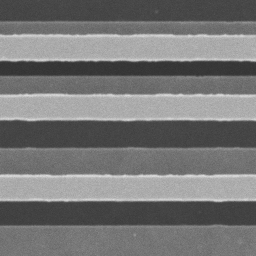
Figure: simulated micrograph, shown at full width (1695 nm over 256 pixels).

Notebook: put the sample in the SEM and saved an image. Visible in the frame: lines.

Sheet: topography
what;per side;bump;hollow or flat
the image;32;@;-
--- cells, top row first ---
--------------------------------
--------------------------------
--------------------------------
@@@@@@@@@@@@@@@@@@@@@@@@@@@@@@@@
@@@@@@@@@@@@@@@@@@@@@@@@@@@@@@@@
@@@@@@@@@@@@@@@@@@@@@@@@@@@@@@@@
@@@@@@@@@@@@@@@@@@@@@@@@@@@@@@@@
@@@@@@@@@@@@@@@@@@@@@@@@@@@@@@@@
--------------------------------
--------------------------------
@@@@@@@@@@@@@@@@@@@@@@@@@@@@@@@@
@@@@@@@@@@@@@@@@@@@@@@@@@@@@@@@@
@@@@@@@@@@@@@@@@@@@@@@@@@@@@@@@@
@@@@@@@@@@@@@@@@@@@@@@@@@@@@@@@@
@@@@@@@@@@@@@@@@@@@@@@@@@@@@@@@@
--------------------------------
--------------------------------
--------------------------------
---@------------@@-------@-@-@--
@@@@@@@@@@@@@@@@@@@@@@@@@@@@@@@@
@@@@@@@@@@@@@@@@@@@@@@@@@@@@@@@@
@@@@@@@@@@@@@@@@@@@@@@@@@@@@@@@@
@@@@@@@@@@@@@@@@@@@@@@@@@@@@@@@@
@@@@@@@@@@@@@@@@@@@@@@@@@@@@@@@@
@@@@@@@@@@@@@@@@@@@@@@@@@@@@@@@@
--------------------------------
--------------------------------
--------------------------------
@@@@@@@@@@@@@@@@@@@@@@@@@@@@@@@@
@@@@@@@@@@@@@@@@@@@@@@@@@@@@@@@@
@@@@@@@@@@@@@@@@@@@@@@@@@@@@@@@@
@@@@@@@@@@@@@@@@@@@@@@@@@@@@@@@@